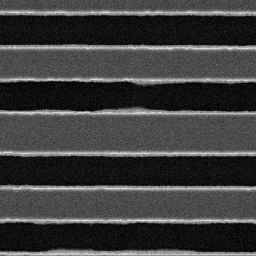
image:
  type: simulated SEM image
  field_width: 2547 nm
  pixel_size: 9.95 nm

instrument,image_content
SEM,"lines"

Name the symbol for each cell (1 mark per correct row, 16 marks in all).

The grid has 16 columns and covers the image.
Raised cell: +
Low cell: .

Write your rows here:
++++++++++++++++
................
................
++++++++++++++++
++++++++++++++++
................
................
++++++++++++++++
++++++++++++++++
++++++++++++++++
................
................
++++++++++++++++
++++++++++++++++
................
................